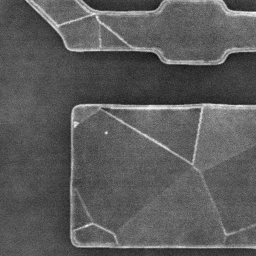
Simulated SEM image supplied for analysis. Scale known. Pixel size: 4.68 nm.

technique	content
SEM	wiring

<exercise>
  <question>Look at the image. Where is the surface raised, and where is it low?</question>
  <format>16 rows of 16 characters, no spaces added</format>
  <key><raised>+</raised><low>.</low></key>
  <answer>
..++++....++++..
...+++++++++++++
....++++++++++++
..........++++..
................
................
................
....++++++++++++
....++++++++++++
....++++++++++++
....++++++++++++
....++++++++++++
....++++++++++++
....++++++++++++
....++++++++++++
...............+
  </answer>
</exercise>